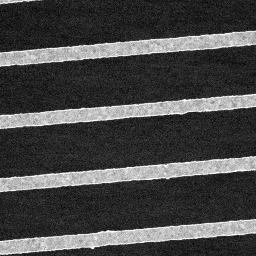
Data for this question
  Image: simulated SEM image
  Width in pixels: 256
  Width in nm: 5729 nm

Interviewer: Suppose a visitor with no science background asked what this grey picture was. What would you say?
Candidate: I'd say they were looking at one or a few lines or trenches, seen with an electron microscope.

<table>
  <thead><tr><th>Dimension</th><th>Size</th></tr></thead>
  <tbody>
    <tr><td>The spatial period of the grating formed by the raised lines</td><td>1400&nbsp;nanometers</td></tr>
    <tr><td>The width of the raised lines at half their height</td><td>295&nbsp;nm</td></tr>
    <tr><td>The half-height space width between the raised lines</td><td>1.11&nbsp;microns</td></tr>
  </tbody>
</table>